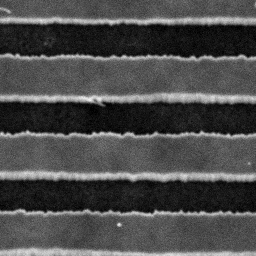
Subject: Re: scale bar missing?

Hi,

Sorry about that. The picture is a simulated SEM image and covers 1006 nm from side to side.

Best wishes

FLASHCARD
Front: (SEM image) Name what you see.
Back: lines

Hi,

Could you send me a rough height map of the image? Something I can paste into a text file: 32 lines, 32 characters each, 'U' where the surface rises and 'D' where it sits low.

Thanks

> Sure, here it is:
UUUUUUUUUUUUUUUUUUUUUUUUUUUUUUUU
UUUUUUUUUUUUUUUUUUUUUUUUUUUUUUUU
UUUUUUUUUUUUUUUUUUUUUUUUUUUUUUUU
DDDDDDDDDDDDDDDDDDDDDDDDDDDDDDDD
DDDDDDDDDDDDDDDDDDDDDDDDDDDDDDDD
DDDDDDDDDDDDDDDDDDDDDDDDDDDDDDDD
DDDDDDDDDDDDDDDDDDDDDDDDDDDDDDDD
UUUUUUUUUUUUUUUUUUUUUUUUUUUUUUUU
UUUUUUUUUUUUUUUUUUUUUUUUUUUUUUUU
UUUUUUUUUUUUUUUUUUUUUUUUUUUUUUUU
UUUUUUUUUUUUUUUUUUUUUUUUUUUUUUUU
UUUUUUUUUUUUUUUUUUUUUUUUUUUUUUUU
UUUUUUUUUUUUUUUUUUUUUUUUUUUUUUUU
DDDDDDDDDDDDDDDDDDDDDDDDDDDDDDDD
DDDDDDDDDDDDDDDDDDDDDDDDDDDDDDDD
DDDDDDDDDDDDDDDDDDDDDDDDDDDDDDDD
DDDUDDDDDDDDDDDDDDDDDDDDDDDDDDDD
UUUUUUUUUUUUUUUUUUUUUUUUUUUUUUUU
UUUUUUUUUUUUUUUUUUUUUUUUUUUUUUUU
UUUUUUUUUUUUUUUUUUUUUUUUUUUUUUUU
UUUUUUUUUUUUUUUUUUUUUUUUUUUUUUUU
UUUUUUUUUUUUUUUUUUUUUUUUUUUUUUUU
DDDDDDDDDDDDDDDDDDDDUDDDDDDDDDDD
DDDDDDDDDDDDDDDDDDDDDDDDDDDDDDDD
DDDDDDDDDDDDDDDDDDDDDDDDDDDDDDDD
DDDDDDDDDDDDDDDDDDDDDDDDDDDDDDDD
UUUUUDUDUUUUDUUDUDDUUDUDDDDUUDDD
UUUUUUUUUUUUUUUUUUUUUUUUUUUUUUUU
UUUUUUUUUUUUUUUUUUUUUUUUUUUUUUUU
UUUUUUUUUUUUUUUUUUUUUUUUUUUUUUUU
UUUUUUUUUUUUUUUUUUUUUUUUUUUUUUUU
UUUUUUUUUUUUUUUUUUUUUUUUUUUUUUUU